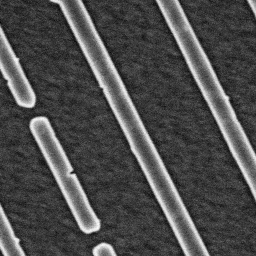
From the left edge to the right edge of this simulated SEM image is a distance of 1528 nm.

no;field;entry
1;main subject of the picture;one or a few lines or trenches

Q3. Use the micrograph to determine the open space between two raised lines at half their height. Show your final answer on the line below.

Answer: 0.397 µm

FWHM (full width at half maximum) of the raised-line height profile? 0.108 um